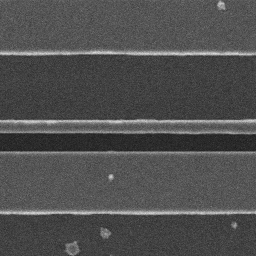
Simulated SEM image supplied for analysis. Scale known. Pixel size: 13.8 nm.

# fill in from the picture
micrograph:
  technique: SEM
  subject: lines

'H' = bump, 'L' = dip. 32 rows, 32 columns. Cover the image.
HHHHHHHHHHHHHHHHHHHHHHHHHHHHHHHH
HHHHHHHHHHHHHHHHHHHHHHHHHHHHHHHH
HHHHHHHHHHHHHHHHHHHHHHHHHHHHHHHH
HHHHHHHHHHHHHHHHHHHHHHHHHHHHHHHH
HHHHHHHHHHHHHHHHHHHHHHHHHHHHHHHH
HHHHHHHHHHHHHHHHHHHHHHHHHHHHHHHH
HHHHHHHHHHHHHHHHHHHHHHHHHHHHHHHH
LLLLLLLLLLLLLLLLLLLLLLLLLLLLLLLL
LLLLLLLLLLLLLLLLLLLLLLLLLLLLLLLL
LLLLLLLLLLLLLLLLLLLLLLLLLLLLLLLL
LLLLLLLLLLLLLLLLLLLLLLLLLLLLLLLL
LLLLLLLLLLLLLLLLLLLLLLLLLLLLLLLL
LLLLLLLLLLLLLLLLLLLLLLLLLLLLLLLL
LLLLLLLLLLLLLLLLLLLLLLLLLLLLLLLL
LLLLLLLLLLLLLLLLLLLLLLLLLLLLLLLL
HHHHHHHHHHHHHHHHHHHHHHHHHHHHHHHH
HHHHHHHHHHHHHHHHHHHHHHHHHHHHHHHH
LLLLLLLLLLLLLLLLLLLLLLLLLLLLLLLL
LLLLLLLLLLLLLLLLLLLLLLLLLLLLLLLL
HHHHHHHHHHHHHHHHHHHHHHHHHHHHHHHH
HHHHHHHHHHHHHHHHHHHHHHHHHHHHHHHH
HHHHHHHHHHHHHHHHHHHHHHHHHHHHHHHH
HHHHHHHHHHHHHHHHHHHHHHHHHHHHHHHH
HHHHHHHHHHHHHHHHHHHHHHHHHHHHHHHH
HHHHHHHHHHHHHHHHHHHHHHHHHHHHHHHH
HHHHHHHHHHHHHHHHHHHHHHHHHHHHHHHH
HHHHHHHHHHHHHHHHHHHHHHHHHHHHHHHH
LLLLLLLLLLLLLLLLLLLLLLLLLLLLLLLL
LLLLLLLLLLLLLLLLLLLLLLLLLLLLLLLL
LLLLLLLLLLLLLLLLLLLLLLLLLLLLLLLL
LLLLLLLLLLLLLLLLLLLLLLLLLLLLLLLL
LLLLLLLLLLLLLLLLLLLLLLLLLLLLLLLL